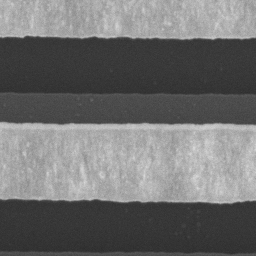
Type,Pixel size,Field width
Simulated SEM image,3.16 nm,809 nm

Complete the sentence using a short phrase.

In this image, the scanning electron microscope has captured lines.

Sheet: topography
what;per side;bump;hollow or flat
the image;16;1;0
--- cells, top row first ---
1111111111111111
1111111111111111
0000000000000000
0000000000000000
0000000000000000
0000000000000000
1111111111111111
1111111111111111
1111111111111111
1111111111111111
1111111111111111
1111111111111111
0000100111111111
0000000000000000
0000000000000000
0000000000000000